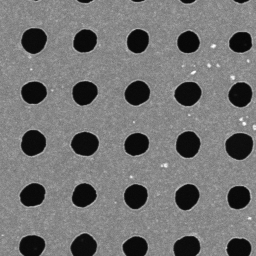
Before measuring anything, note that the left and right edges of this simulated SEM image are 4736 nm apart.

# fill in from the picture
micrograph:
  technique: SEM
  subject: a regular array of holes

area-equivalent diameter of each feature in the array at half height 460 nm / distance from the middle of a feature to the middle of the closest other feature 51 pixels